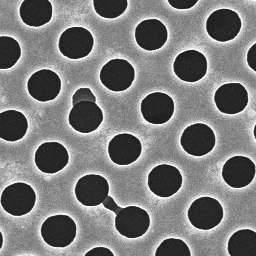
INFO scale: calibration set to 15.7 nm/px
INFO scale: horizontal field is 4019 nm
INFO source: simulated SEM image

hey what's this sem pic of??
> a regular array of holes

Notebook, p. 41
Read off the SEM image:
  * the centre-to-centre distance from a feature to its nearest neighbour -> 806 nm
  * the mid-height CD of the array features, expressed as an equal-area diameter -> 529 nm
